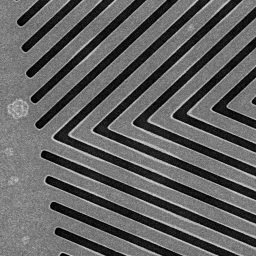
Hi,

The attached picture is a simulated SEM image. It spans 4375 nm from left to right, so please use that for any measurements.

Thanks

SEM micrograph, groups of lines, slits or small figures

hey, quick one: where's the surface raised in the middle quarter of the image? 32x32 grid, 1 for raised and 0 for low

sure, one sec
00011111000111110001111100011111
00111110001111100011111000111110
01111100011111000111110001111100
11111000111110001111100011111000
11110001111100011111000111110001
11100011111000111110001111100011
10000111110001111000011111000111
00001111100011110000111110001111
00011110000111100001111000011110
00111100001111000011110000111100
11111000111110001111100011111000
11110001111100001111000111110000
11100001111000111110000111100001
11000111110001111100011111100000
10001111100011111000001111111000
00011111000111111000000111111111
00111110000011111111000000111111
01111111000000111111110000001111
00011111110000001111111100000011
00000111111110000000111111100000
10000001111111100000001111111100
11100000001111111000000011111111
11111100000011111111000000111111
11111111000000111111110000000111
00011111111000000111111100000001
00000111111110000001111111100000
10000000111111110000001111111100
11110000001111111100000011111111
11111100000011111111000000111111
11111111100000111111110000000111
00011111111000000111111110000001
00000111111110000001111111100000